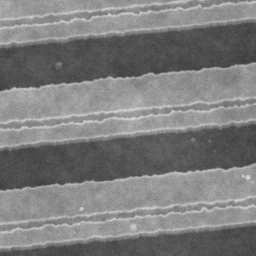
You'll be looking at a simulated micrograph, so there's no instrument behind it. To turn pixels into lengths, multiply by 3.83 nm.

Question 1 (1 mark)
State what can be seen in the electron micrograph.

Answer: lines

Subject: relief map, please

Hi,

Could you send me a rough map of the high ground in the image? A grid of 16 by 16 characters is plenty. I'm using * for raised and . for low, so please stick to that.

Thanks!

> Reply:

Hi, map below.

****************
*************...
***.............
................
...........*****
..**************
****************
****************
*******.........
................
...............*
.....***********
****************
****************
**********......
................